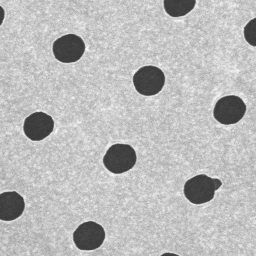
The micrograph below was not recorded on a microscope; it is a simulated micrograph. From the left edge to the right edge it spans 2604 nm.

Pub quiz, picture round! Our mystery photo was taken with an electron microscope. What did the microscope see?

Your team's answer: holes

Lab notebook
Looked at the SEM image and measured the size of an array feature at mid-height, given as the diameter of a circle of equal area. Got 316 nanometres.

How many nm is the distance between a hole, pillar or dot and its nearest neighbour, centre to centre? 847